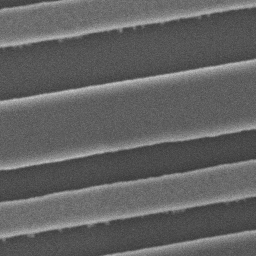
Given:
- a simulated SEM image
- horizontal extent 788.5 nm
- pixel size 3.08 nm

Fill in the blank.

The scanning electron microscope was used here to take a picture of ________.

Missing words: lines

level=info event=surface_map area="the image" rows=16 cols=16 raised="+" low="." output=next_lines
.++++++++++++++.
+++++++++.......
+++.............
................
...........+++++
.....+++++++++++
++++++++++++++++
++++++++++++++++
+++++++++++++...
+++++++.........
+............+++
.......+++++++++
.++++++++++++++.
+++++++++.......
++.............+
.........+++++++